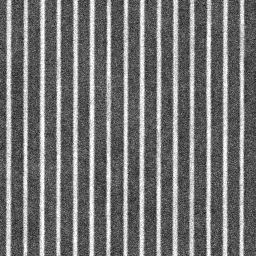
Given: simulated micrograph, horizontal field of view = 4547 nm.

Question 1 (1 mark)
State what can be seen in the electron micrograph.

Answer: parallel lines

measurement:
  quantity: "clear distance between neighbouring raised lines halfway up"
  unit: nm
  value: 251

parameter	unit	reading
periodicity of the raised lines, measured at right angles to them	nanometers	296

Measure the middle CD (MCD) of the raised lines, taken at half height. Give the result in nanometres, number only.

51.1